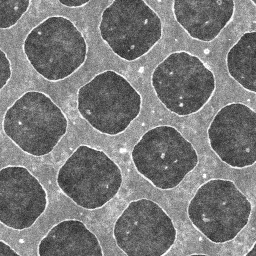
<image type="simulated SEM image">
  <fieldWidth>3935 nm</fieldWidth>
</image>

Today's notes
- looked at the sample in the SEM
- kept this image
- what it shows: holes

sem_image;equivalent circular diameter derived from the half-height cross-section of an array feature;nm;934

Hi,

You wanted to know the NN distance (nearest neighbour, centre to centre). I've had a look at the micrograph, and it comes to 1170 nm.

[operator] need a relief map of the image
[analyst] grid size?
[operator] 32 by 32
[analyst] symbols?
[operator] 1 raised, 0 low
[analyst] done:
00001111001111000011110000000111
00011111111110000001110000000111
00111100011110000000110000000111
01110000001110000000111000001111
11100000001110000000111100011100
11100000000110000001111111111000
11100000000111000011111111111000
01110000000111110111100001110000
01110000001111111110000000110000
01111000011100011110000000011000
01111111111000001110000000011100
11110111110000000110000000011111
11000011110000000011000000111111
10000001110000000011100001110001
10000000110000000111111111100000
00000000111000001111111111000000
10000000111110011100001111000000
10000001111111111000000111000000
11100001110111111000000011100000
11111111100001110000000001100000
11111111000000111000000001110000
00001110000000011000000011111111
00000110000000011110000111001111
00000111000000011111001110000011
00000011000000111111111100000001
00000011110001110000111100000001
00000111111111100000011100000001
00000111111111100000011100000001
11011110000111000000001110000011
11111100000011000000001111000111
01111000000011100000001111111111
00111000000001110000011111111110